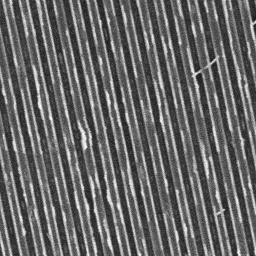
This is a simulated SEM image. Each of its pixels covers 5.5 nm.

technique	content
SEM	parallel lines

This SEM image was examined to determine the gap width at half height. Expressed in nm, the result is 35.7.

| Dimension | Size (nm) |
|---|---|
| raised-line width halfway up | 51.2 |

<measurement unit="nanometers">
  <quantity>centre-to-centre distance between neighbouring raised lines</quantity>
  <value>90.9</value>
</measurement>